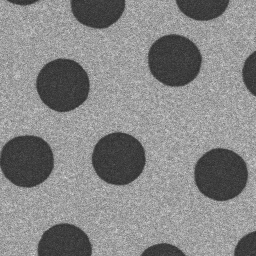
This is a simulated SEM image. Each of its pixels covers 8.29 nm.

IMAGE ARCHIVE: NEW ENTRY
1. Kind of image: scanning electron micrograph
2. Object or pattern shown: holes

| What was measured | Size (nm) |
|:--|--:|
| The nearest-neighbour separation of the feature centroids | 812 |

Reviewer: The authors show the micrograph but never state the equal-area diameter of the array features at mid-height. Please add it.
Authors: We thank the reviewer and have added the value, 439 nanometres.